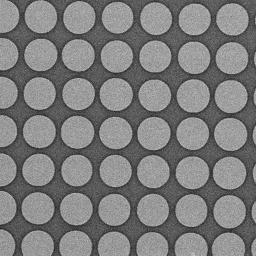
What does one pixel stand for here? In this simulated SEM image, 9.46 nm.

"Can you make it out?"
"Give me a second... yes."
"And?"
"an array of small figures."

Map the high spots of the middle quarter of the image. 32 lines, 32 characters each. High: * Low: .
.******...******....******...***
..***......****......****.....**
................................
................................
.*****....******.....****.....**
*******...*******..*******...***
********.********..*******...***
********.********..********.****
********.********..********.****
*******..********..*******...***
.*****....******....******...***
............**.......***......**
................................
..***.......**.......***........
******....******....*****....***
*******..********..*******...***
*******..********..*******..****
*******..********.********..****
*******..********.********..****
*******...******...*******...***
.*****.....****.....*****.....**
................................
................................
.*****.....****.....****.......*
******....******...******....***
*******..********..*******..****
*******..********.********..****
*******..********.********..****
*******..*******...*******..****
.*****....******...******....***
............**......****......**
................................